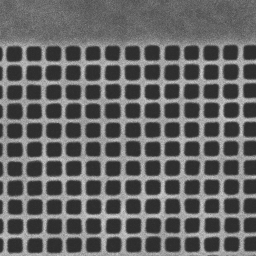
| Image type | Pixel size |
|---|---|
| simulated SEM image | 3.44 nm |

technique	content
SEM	a regular array of holes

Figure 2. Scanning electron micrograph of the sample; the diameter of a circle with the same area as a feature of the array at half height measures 57.1 nm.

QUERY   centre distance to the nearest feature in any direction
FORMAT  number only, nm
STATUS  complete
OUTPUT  65.2